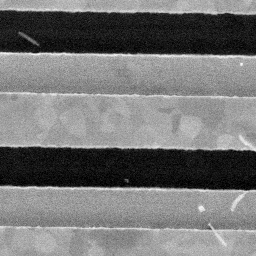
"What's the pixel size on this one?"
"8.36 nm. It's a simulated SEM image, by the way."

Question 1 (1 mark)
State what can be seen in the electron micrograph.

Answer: lines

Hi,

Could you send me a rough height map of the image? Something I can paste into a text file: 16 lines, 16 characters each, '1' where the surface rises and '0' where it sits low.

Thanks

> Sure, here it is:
1111111111111111
0000000000000000
0000000000000000
1111111111110000
1111111111111111
1111111111111111
1111111111111111
1111111111111111
1111111111111111
0000000000000000
0000000000000000
0000000000000000
1111111111111111
1111111111111111
1111111111111111
1111111111111111